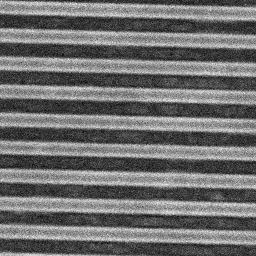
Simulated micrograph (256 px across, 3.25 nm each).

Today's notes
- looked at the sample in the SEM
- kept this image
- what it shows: parallel lines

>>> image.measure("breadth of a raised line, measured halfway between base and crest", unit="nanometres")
43.5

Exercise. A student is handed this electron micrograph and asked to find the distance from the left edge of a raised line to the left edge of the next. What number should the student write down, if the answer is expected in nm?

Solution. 91.1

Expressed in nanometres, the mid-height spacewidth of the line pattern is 46.8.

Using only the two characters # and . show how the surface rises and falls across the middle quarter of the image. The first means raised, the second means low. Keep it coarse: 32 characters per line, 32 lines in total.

################################
################################
...........................#####
................................
................................
................................
################################
################################
################################
............................####
................................
................................
................................
##########################......
################################
################################
.....................###########
................................
................................
................................
############################....
################################
################################
.......................#########
................................
................................
................................
#############################...
################################
################################
.........................#######
................................